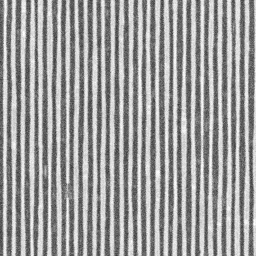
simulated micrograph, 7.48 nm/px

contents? parallel lines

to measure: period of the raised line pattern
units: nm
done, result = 67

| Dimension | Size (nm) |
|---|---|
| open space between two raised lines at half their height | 41.2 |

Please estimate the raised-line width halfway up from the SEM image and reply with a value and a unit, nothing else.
27.1 nm